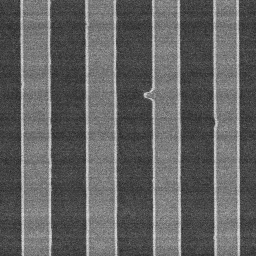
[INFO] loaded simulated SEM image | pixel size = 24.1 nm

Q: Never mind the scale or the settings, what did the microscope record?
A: one or a few lines or trenches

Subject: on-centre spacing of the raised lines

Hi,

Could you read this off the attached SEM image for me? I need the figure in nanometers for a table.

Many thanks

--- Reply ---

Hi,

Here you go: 1530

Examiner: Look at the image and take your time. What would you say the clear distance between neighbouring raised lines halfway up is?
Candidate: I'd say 0.899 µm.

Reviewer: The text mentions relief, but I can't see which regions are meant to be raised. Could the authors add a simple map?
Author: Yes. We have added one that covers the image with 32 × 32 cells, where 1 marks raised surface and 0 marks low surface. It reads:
00011100000111000001110000011100
00011100000111000001110000011100
00011100000111000001110000011100
00011100000111000001110000011100
00011100000111000001110000011100
00011100000111000001110000011100
00011100000111000001110000011100
00011100000111000001110000011100
00011100000111000001110000011100
00011100000111000001110000011100
00011100000111000001110000011100
00011100000111000001110000011100
00011100000111000001110000011100
00011100000111000001110000011100
00011100000111000001110000011100
00011100000111000001110000011100
00011100000111000001110000011100
00011100000111000001110000011100
00011100000111000001110000011100
00011100000111000001110000011100
00011100000111000001110000011100
00011100000111000001110000011100
00011100000111000001110000011100
00011100000111000001110000011100
00011100000111000001110000011100
00011100000111000001110000011100
00011100000111000001110000011100
00011100000111000001110000011100
00011100000111000001110000011100
00011100000111000001110000011100
00011100000111000001110000011100
00011100000111000001110000011100